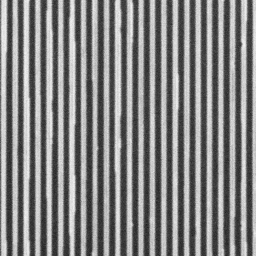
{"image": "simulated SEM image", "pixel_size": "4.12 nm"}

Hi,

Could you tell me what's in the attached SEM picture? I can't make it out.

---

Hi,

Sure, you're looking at parallel lines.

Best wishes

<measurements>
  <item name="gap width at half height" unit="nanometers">32.4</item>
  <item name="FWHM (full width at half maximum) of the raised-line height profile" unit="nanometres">16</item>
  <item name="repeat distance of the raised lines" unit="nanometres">47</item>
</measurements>